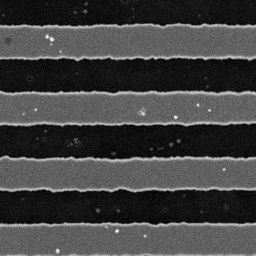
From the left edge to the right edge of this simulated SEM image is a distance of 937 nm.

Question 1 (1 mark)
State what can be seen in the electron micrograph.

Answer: lines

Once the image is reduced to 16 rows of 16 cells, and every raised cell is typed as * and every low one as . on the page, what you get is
................
................
****************
****************
................
................
****************
****************
................
................
****************
****************
................
................
****************
****************